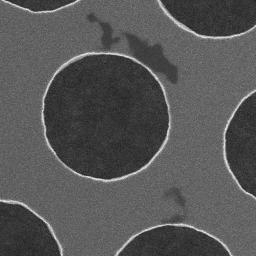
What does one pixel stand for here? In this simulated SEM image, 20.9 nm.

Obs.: holes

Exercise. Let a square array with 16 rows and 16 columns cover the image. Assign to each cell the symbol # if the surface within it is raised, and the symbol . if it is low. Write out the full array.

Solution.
#...######......
###########.....
################
#####...########
####.....#######
###.......######
###.......#####.
###........###..
###.......####..
###.......####..
####.....#####..
###############.
################
..##############
...######....###
....####......##